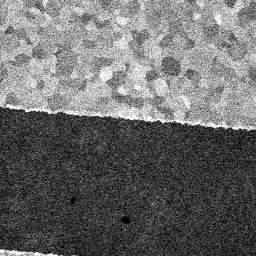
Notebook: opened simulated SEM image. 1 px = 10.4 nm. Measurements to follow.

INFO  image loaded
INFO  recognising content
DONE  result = one or a few lines or trenches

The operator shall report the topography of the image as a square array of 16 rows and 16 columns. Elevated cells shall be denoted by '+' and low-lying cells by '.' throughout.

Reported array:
++++++++++++++++
++++++++++++++++
++++++++++++++++
++++++++++++++++
++++++++++++++++
++++++++++++++++
++++++++++++++++
.........+++++++
................
................
................
................
................
................
................
................